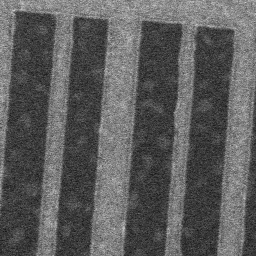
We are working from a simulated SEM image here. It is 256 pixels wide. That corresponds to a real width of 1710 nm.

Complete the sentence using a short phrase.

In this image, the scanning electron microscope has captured one or a few lines or trenches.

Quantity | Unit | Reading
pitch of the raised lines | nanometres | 406